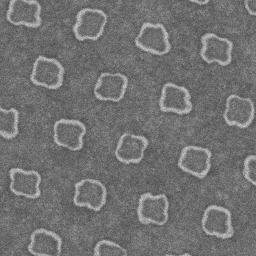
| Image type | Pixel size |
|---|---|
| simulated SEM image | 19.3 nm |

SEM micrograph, a regular array of raised bodies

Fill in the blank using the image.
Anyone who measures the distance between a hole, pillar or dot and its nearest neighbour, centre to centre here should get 1.23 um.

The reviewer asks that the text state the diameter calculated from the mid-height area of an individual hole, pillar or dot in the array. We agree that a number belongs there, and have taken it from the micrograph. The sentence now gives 555 nm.